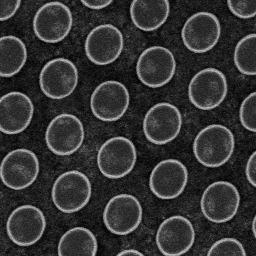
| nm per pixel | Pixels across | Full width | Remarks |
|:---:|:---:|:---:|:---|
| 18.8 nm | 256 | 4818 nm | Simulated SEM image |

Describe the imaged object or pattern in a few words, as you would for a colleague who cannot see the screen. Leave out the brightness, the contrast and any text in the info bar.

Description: a regular array of raised bodies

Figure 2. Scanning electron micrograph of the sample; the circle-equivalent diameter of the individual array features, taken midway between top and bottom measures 716 nanometers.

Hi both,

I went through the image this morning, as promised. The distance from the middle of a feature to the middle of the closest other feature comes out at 1060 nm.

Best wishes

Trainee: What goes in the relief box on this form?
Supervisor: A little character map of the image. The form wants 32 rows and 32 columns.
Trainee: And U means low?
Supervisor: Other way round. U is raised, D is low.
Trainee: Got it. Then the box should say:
UUDDDDUDDDDUUDDDDUUUUDDDDDDDDUUU
UUDDDUUUUDDDDDDDUUUUUDDDDDDDDUUU
DDDDUUUUUDDDDDDDDUUUUDDDUUUDDDDD
DDDDUUUUUDDDUUDDDUUDDDDUUUUDDDDD
DDDDDUUUDDDUUUUDDDDDDDDUUUUDDDDU
UUUDDDDDDDDUUUUDDDDDDDDUUUUDDDUU
UUUDDDDDDDDUUUUDDDUUUDDDDDDDDUUU
UUUDDDDUDDDDUUDDDUUUUUDDDDDDDUUU
UUUDDDUUUDDDDDDDDUUUUUDDDDDDDDUU
DDDDDUUUUUDDDDDDDUUUUDDDUUUUDDDD
DDDDDUUUUDDDDUUDDDUUDDDDUUUUDDDD
DDDDDDUUUDDDUUUUDDDDDDDDUUUUDDDD
UUUUDDDDDDDUUUUUDDDDDDDDUUUUDDDU
UUUUDDDDDDDUUUUUDDDUUUDDDUDDDDUU
UUUUDDDDUDDDUUUDDDUUUUDDDDDDDDUU
UUUDDDUUUUDDDDDDDDUUUUUDDDDDDDUU
DUDDDDUUUUDDDDDDDDUUUUDDDUUUUDDD
DDDDDDUUUUDDDDUUDDDUUDDDDUUUUDDD
DDDDDDUUUUDDDUUUUDDDDDDDUUUUUDDD
DUUUDDDDDDDDUUUUUDDDDDDDDUUUUDDU
UUUUUDDDDDDDUUUUUDDDUUUDDDUUDDDU
UUUUUDDDDDDDDUUUDDDUUUUDDDDDDDDU
UUUUDDDUUUUDDDDDDDDUUUUDDDDDDDDU
DDUDDDDUUUUDDDDDDDDUUUUDDDUUUDDD
DDDDDDDUUUUDDDDUDDDDUUDDDUUUUUDD
DDDDDDDUUUUDDDUUUDDDDDDDDUUUUUDD
DDUUUDDDDDDDDUUUUUDDDDDDDUUUUDDD
DUUUUDDDDDDDDUUUUDDDDUUDDDUUDDDD
DUUUUDDDDDDDDDUUUDDDUUUUDDDDDDDD
DUUUUDDDUUUUDDDDDDDDUUUUDDDDDDDD
DDUUDDDUUUUUDDDDDDDDUUUUDDDUUUDD
DDDDDDDUUUUUDDDUUDDDUUUDDDUUUUUD